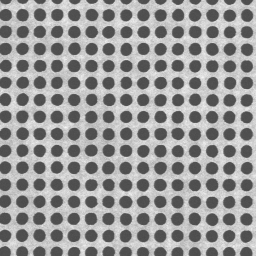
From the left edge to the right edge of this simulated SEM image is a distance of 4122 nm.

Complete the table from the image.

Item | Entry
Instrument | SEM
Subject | a regular array of holes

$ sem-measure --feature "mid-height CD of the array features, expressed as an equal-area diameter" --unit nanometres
201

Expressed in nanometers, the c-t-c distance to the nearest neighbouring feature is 268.